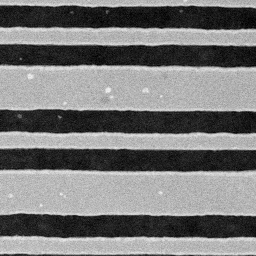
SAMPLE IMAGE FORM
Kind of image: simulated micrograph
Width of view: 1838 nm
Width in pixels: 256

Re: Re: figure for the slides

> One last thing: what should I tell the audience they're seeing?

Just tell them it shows lines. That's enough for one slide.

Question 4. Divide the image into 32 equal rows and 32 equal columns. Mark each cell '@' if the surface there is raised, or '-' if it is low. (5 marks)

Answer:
@@@@@@@@@@@@@@@@@@@@@@@@@@@@@@@@
--------------------------------
--------------------------------
@@@@--@@------@-----------------
@@@@@@@@@@@@@@@@@@@@@@@@@@@@@@@@
-----@@@@@@@@@@@@@@@@-@@@@@@@@@@
--------------------------------
--------------------------------
@@@@@@@@@@@@@@@@@@@@@@@@@@@@-@@@
@@@@@@@@@@@@@@@@@@@@@@@@@@@@@@@@
@@@@@@@@@@@@@@@@@@@@@@@@@@@@@@@@
@@@@@@@@@@@@@@@@@@@@@@@@@@@@@@@@
@@@@@@@@@@@@@@@@@@@@@@@@@@@@@@@@
@@@@@@@@@@@@@@@@@@@@@@@@@@@@@@@@
--------------------------------
--------------------------------
--------------------------------
@@@@@@@@@@@@@@@@@@@@@@@@@@@@@@@@
@@-@-@@@@@@@@@@@@@@@@@@@@@@@@@@@
--------------------------------
--------------------------------
@@@@@@@@@@@@@@@@@@@@@@@@@@@@@@@@
@@@@@@@@@@@@@@@@@@@@@@@@@@@@@@@@
@@@@@@@@@@@@@@@@@@@@@@@@@@@@@@@@
@@@@@@@@@@@@@@@@@@@@@@@@@@@@@@@@
@@@@@@@@@@@@@@@@@@@@@@@@@@@@@@@@
@@@@@@@@@@@@@@@@@@@@@@@@@@@@@@@@
--------------------------------
--------------------------------
--@-----------------------------
@@@@@@@@@@@@@@@@@@@@@@@@@@@@@@@@
@@@@@@@@@@@@@@@@@@@@@@@@@@@@@@@@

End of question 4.